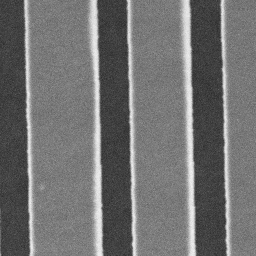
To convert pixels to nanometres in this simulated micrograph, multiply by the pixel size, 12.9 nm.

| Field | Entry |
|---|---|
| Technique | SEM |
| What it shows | lines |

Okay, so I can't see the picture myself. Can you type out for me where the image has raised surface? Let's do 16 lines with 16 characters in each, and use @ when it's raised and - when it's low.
--@@@@--@@@@--@@
--@@@@--@@@@--@@
--@@@@--@@@@--@@
--@@@@--@@@@--@@
--@@@@--@@@@--@@
--@@@@--@@@@--@@
--@@@@--@@@@--@@
--@@@@--@@@@--@@
--@@@@--@@@@--@@
--@@@@--@@@@--@@
--@@@@--@@@@--@@
--@@@@--@@@@--@@
--@@@@--@@@@--@@
--@@@@--@@@@--@@
--@@@@--@@@@--@@
--@@@@--@@@@--@@